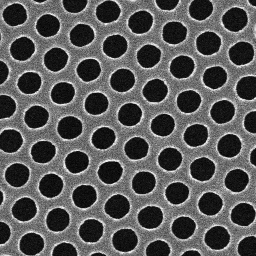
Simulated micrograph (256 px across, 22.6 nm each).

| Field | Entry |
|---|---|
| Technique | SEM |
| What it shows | a regular array of holes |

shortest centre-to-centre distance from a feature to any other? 781 nanometers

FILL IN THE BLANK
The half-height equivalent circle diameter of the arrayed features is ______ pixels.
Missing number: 24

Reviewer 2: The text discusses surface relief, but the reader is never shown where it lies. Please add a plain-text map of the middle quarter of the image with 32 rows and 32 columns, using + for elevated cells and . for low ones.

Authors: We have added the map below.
+++......++++++++++....+++......
+++......++++...++++++++++......
+++......+++.....++++++++++.....
++++....++++......++++++++++..++
++++++++++++......+++....+++++++
..++++++++++.....+++......++++++
...++++++++++...++++......++++++
...++++...++++++++++......+++...
..++++.....+++++++++.....+++....
.++++......+++++++++++..++++....
+++++......+++.....+++++++++....
+++++......+++.....++++++++++...
+++++++..+++++......++++.+++++++
...++++++++++......++++....+++++
....++++++++++.....+++......++++
.....+++++++++++.+++++......+++.
.....+++....++++++++++.....+++..
....+++......++++++++++....+++..
...++++......++++..+++++++++++..
+++++++.....++++.....+++++++++..
++++++++....+++......++++++++++.
+++++++++++++++......++++...++++
+....++++++++++......+++.....+++
......++++++++++....+++.......++
......++++....++++++++++.....+++
......+++.....++++++++++.....+++
+....+++.......++++++++++...++++
++++++++......++++....++++++++++
+++++++++.....+++......+++++++++
++++++++++...++++......+++++++++
++++...++++++++++......+++.....+
+++.....+++++++++.....+++......+